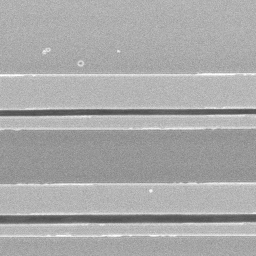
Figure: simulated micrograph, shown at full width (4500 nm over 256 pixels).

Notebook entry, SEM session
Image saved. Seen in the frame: lines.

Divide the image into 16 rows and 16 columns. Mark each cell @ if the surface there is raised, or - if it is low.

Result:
----------------
----------------
----------------
----------------
----------------
@@@@@@@@@@@@@@@@
@@@@@@@@@@@@@@@@
@@@@@@@@@@@@@@@@
----------------
----------------
----------------
---------------@
@@@@@@@@@@@@@@@@
@@@@@@@@@@-@@@@@
@@@@@@@@@@@@@@@@
----------------